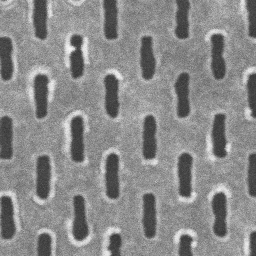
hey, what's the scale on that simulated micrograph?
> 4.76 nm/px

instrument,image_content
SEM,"a regular array of holes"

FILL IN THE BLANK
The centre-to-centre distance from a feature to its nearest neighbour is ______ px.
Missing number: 51.4